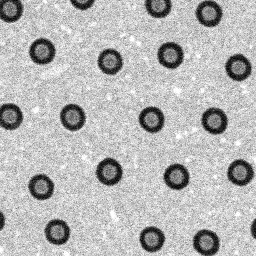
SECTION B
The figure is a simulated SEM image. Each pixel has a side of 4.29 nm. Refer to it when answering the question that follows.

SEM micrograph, a regular array of ring-shaped grooves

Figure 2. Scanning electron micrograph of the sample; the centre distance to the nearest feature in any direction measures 261 nm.